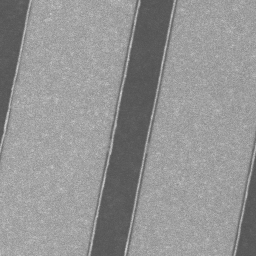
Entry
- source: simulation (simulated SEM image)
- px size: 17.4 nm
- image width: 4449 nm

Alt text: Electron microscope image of one or a few lines or trenches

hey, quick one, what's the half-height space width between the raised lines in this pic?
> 107 pixels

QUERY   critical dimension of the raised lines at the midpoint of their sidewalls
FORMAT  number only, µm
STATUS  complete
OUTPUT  0.608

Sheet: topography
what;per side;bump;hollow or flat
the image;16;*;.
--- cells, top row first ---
**.......**.....
**......***.....
*.......**......
*.......**......
*.......**......
*.......**......
*......***......
.......**.......
.......**.......
.......**.......
.......**.......
......***......*
......**.......*
......**.......*
......**.......*
......**.......*